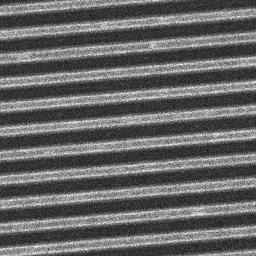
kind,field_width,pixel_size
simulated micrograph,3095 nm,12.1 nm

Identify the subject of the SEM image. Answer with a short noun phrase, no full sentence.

parallel lines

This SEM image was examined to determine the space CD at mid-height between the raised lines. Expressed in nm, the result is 169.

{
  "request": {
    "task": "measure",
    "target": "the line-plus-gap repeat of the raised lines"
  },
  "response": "292 nanometers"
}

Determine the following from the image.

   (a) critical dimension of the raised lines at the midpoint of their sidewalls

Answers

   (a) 125 nanometers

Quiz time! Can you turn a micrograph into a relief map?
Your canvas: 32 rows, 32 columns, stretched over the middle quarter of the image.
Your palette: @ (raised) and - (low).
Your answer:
-------------------@-@@@@@@@@@@@
---------@@@@@@@@@@@@@@@@@@@@@@@
@@@@@@@@@@@@@@@@@@@@@@@@@-------
@@@@@@@@@@@@@@------------------
@@------------------------------
--------------------------------
--------------------@@@@@@@@@@@@
----------@@@@@@@@@@@@@@@@@@@@@@
@@@@@@@@@@@@@@@@@@@@@@@@@@------
@@@@@@@@@@@@@@@-----------------
@@@-----------------------------
--------------------------------
--------------------@@@@@@@@@@@@
---------@@@@@@@@@@@@@@@@@@@@@@@
@@@@@@@@@@@@@@@@@@@@@@@@@-------
@@@@@@@@@@@@@-------------------
@@------------------------------
--------------------------------
---------------------@@@@@@@@@@@
----------@@@@@@@@@@@@@@@@@@@@@@
@@@@@@@@@@@@@@@@@@@@@@@@@@@@@---
@@@@@@@@@@@@@@@@@---------------
@@@@@@--------------------------
--------------------------------
----------------------@@@@@@@@@@
-----------@@@@@@@@@@@@@@@@@@@@@
@@@@@@@@@@@@@@@@@@@@@@@@@@@-----
@@@@@@@@@@@@@@@-----------------
@@@@----------------------------
--------------------------------
------------------------@@@@@@@@
------------@@@@@@@@@@@@@@@@@@@@